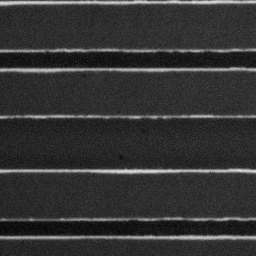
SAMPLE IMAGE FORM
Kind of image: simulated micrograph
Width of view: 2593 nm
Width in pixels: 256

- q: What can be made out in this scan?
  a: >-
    lines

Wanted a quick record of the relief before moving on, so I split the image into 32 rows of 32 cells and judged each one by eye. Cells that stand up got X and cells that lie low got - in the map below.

XXXXXXXXXXXXXXXXXXXXXXXXXXXXXXXX
XXXXXXXXXXXXXXXXXXXXXXXXXXXXXXXX
XXXXXXXXXXXXXXXXXXXXXXXXXXXXXXXX
XXXXXXXXXXXXXXXXXXXXXXXXXXXXXXXX
XXXXXXXXXXXXXXXXXXXXXXXXXXXXXXXX
XXXXXXXXXXXXXXXXXXXXXXXXXXXXXXXX
--------------------------------
--------------------------------
--------------------------------
XXXXXXXXXXXXXXXXXXXXXXXXXXXXXXXX
XXXXXXXXXXXXXXXXXXXXXXXXXXXXXXXX
XXXXXXXXXXXXXXXXXXXXXXXXXXXXXXXX
XXXXXXXXXXXXXXXXXXXXXXXXXXXXXXXX
XXXXXXXXXXXXXXXXXXXXXXXXXXXXXXXX
XXXXXXXXXXXXXXXXXXXXXXXXXXXXXXXX
--------------------------------
--------------------------------
--------------------------------
--------------------------------
--------------------------------
--------------------------------
XXXXXXXXXXXXXXXXXXXXXXXXXXXXXXXX
XXXXXXXXXXXXXXXXXXXXXXXXXXXXXXXX
XXXXXXXXXXXXXXXXXXXXXXXXXXXXXXXX
XXXXXXXXXXXXXXXXXXXXXXXXXXXXXXXX
XXXXXXXXXXXXXXXXXXXXXXXXXXXXXXXX
XXXXXXXXXXXXXXXXXXXXXXXXXXXXXXXX
--------------------------------
--------------------------------
--------------------------------
XXXXXXXXXXXXXXXXXXXXXXXXXXXXXXXX
XXXXXXXXXXXXXXXXXXXXXXXXXXXXXXXX